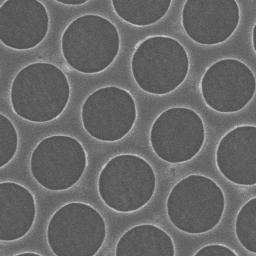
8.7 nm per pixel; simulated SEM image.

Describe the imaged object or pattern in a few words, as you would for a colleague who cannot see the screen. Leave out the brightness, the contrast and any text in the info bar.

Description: a regular array of holes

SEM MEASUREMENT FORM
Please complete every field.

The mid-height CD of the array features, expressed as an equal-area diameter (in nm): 496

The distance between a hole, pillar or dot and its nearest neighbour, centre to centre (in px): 70.2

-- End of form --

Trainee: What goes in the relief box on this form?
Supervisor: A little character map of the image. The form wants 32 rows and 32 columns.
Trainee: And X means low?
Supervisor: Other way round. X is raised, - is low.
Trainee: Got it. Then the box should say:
-----XXX--XXXX-------XX-------XX
------XXXXXXXX-------XX-------XX
------XXX----XXX----XXX-------XX
------XX------XXXXXXXXX------XXX
------XX-------XXXXXXXXX-----XXX
X----XXX-------XXX-----XXXXXXXXX
XXXXXXXX-------XX------XXXXXXXXX
XXXXXXXX------XXX-------XXXX--XX
XXX----XX----XXXX-------XX-----X
XX------XXXXXXXXX------XX-------
XX-------XXXXXXXX------XX-------
X--------XXX----XX---XXXX-------
X-------XXX------XXXXXXXXX-----X
XX------XX-------XXXXX-XXXX---XX
XXX----XXX-------XXX-----XXXXXXX
--XXXXXXXX-------XX------XXXXXXX
--XXXXXXXXX-----XXX-------XXX---
--XXX----XXXX--XXXX------XXX----
--XX------XXXXXXXXX------XX-----
--XX-------XXXX--XXX----XXX-----
-XXX-------XX------XXXXXXXX-----
XXXX------XXX------XXXXXXXXX----
XXXXX-----XX-------XXXX---XXX---
---XXX---XXX-------XXX-----XXXXX
----XXXXXXXXX------XX-------XXXX
----XXXX---XX-----XXX-------XXX-
----XXX-----XXXXXXXXX-------XX--
----XX-------XXXXXXXX------XXX--
----XX-------XXXX---XX-----XX---
---XXX-------XX------XXXXXXXXX--
XXXXXX-------XX-------XXXXXXXX--
XXXXXXX-----XX--------XXX----XXX